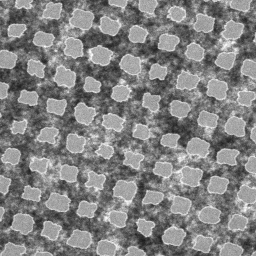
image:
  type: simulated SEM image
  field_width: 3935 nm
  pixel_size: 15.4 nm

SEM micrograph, a regular array of raised bodies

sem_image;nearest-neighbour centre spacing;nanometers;443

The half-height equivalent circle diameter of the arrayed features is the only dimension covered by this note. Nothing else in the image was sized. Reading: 275 nm